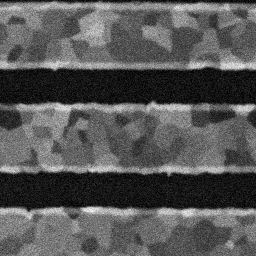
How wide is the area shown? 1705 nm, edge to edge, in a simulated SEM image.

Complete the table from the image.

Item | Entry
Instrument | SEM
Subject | one or a few lines or trenches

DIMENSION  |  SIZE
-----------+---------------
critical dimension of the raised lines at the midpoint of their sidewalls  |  60.7 pixels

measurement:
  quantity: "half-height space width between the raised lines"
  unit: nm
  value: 281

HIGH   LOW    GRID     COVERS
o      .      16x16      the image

oooooooooooooooo
oooooooooooooooo
oooooooooooooooo
oooooooooooooooo
................
................
................
oooooooooooooooo
oooooooooooooooo
oooooooooooooooo
oooooooooooooooo
................
................
oooooooooooooooo
oooooooooooooooo
oooooooooooooooo